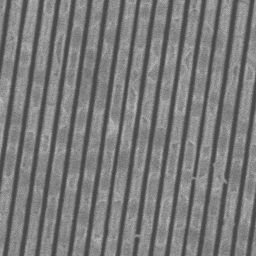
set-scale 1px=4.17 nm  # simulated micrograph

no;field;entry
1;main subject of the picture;parallel lines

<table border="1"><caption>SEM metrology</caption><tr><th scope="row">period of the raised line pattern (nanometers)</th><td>66.9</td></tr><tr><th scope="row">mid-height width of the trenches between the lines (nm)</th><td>20.1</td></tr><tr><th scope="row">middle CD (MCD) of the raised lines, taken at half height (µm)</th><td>0.048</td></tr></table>